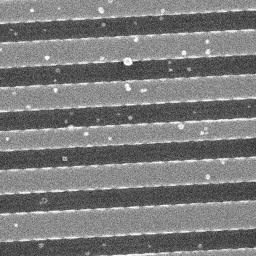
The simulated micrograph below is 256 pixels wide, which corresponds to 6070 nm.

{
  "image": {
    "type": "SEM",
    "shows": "lines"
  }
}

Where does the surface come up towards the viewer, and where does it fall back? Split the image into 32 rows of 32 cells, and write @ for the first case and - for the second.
@@@@@@@@@@@@@@@@@@@@@@@@@@@@@@@@
@@@@@@@@@@@@@@@@@@@@@@@@@@@-----
@@@@@@@-------------------------
--------------------------------
------------------@@@@@@@@@@@@@@
@@@@@@@@@@@@@@@@@@@@@@@@@@@@@@@@
@@@@@@@@@@@@@@@@@@@@@@@@@@@@@@@@
@@@@@@@@@@@@@@@@@@--------------
--------------------------------
---------------------------@@@@@
----------@@@@@@@@@@@@@@@@@@@@@@
@@@@@@@@@@@@@@@@@@@@@@@@@@@@@@@@
@@@@@@@@@@@@@@@@@@@@@@@@@@@-----
@@@@@@@@@-----------------------
--------------------------------
-------------------@@@@@@@@@@@@@
@@@@@@@@@@@@@@@@@@@@@@@@@@@@@@@@
@@@@@@@@@@@@@@@@@@@@@@@@@@------
@@@@@@--------------------------
--------------------------------
-----------------@@@@@@@@@@@@@@@
@@@@@@@@@@@@@@@@@@@@@@@@@@@@@@@@
@@@@@@@@@@@@@@@@@@@@@@@@@@@@@@@@
@@@@@@@@@@@@@@------------------
--------------------------------
-----------------------@@@@@@@@@
------@@@@@@@@@@@@@@@@@@@@@@@@@@
@@@@@@@@@@@@@@@@@@@@@@@@@@@@@@@@
@@@@@@@@@@@@@@@@@@@@@@@@@@@@@@@@
@@@@@@@@@@@@@@------------------
--------------------------------
------------------------@@@@@@@@